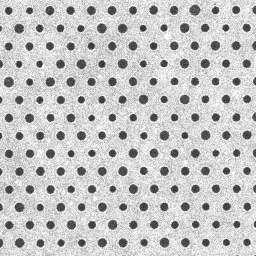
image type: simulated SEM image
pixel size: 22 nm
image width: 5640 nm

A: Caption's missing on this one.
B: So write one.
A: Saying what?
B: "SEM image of a regular array of holes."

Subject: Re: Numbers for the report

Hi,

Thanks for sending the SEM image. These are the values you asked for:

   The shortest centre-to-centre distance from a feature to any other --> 448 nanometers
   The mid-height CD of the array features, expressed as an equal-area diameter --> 0.193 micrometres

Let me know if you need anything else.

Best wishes